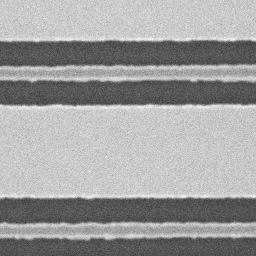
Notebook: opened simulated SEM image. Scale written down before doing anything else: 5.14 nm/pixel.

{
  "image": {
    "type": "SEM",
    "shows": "lines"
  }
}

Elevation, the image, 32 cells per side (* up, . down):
********************************
********************************
********************************
********************************
********************************
................................
................................
................................
******.*************************
********************************
................................
................................
................................
********************************
********************************
********************************
********************************
********************************
********************************
********************************
********************************
********************************
********************************
********************************
********************************
................................
................................
................................
********************************
**********************...**.....
................................
................................